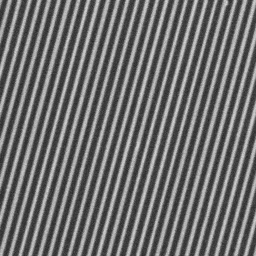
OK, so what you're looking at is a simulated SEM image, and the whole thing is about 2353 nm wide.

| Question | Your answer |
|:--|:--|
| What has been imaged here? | parallel lines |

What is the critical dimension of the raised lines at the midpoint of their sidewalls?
24.4 nm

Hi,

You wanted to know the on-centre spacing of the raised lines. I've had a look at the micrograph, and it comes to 9.47 pixels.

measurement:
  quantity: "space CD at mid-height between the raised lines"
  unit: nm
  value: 64.4